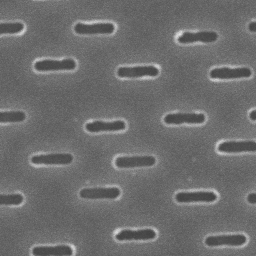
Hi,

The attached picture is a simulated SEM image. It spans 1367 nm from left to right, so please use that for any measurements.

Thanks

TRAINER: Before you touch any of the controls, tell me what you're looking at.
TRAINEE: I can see a regular array of holes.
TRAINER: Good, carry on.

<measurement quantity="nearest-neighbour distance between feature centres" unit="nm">283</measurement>